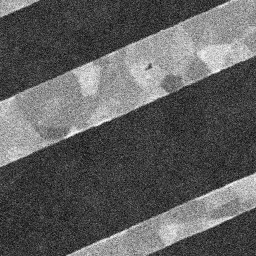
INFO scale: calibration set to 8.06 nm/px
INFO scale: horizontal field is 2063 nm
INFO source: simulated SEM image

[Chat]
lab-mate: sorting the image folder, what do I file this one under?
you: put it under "one or a few lines or trenches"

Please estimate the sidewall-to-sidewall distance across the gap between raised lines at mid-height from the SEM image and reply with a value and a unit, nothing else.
864 nanometres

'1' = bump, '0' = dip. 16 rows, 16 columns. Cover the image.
1000000000000111
0000000000011111
0000000001111111
0000000111111111
0000111111111000
0011111111100000
1111111110000000
1111111000000000
1111000000000000
1100000000000000
0000000000000000
0000000000000011
0000000000001111
0000000000111110
0000000011110000
0000011111000000